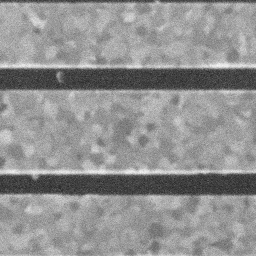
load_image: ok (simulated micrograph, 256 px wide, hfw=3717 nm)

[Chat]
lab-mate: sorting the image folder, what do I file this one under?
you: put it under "lines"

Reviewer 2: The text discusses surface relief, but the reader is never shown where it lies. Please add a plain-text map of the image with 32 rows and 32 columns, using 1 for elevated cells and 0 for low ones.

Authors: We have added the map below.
11111111111111111111111111111111
11111111111111111111111111111111
11111111111111111111111111111111
11111111111111111111111111111111
11111111111111111111111111111111
11111111111111111111111111111111
11111111111111111111111111111111
11111111111111111111111111111111
00000000000000000000000000000000
00000000000000000000000000000000
00000000000000000000000000000000
11111111111111111111111111111111
11111111111111111111111111111111
11111111111111111111111111111111
11111111111111111111111111111111
11111111111111111111111111111111
11111111111111111111111111111111
11111111111111111111111111111111
11111111111111111111111111111111
11111111111111111111111111111111
11111111111111111111111111111111
11111111111111111111111111111111
00000000000000000000000000000000
00000000000000000000000000000000
11111111101110000000000000000000
11111111111111111111111111111111
11111111111111111111111111111111
11111111111111111111111111111111
11111111111111111111111111111111
11111111111111111111111111111111
11111111111111111111111111111111
11111111111111111111111111111111